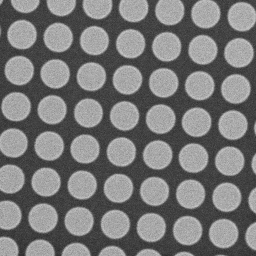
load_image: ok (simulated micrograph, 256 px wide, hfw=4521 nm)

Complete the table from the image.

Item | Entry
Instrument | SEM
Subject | an array of small figures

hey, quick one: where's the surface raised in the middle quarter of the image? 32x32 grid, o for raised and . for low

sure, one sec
o....oooo......oo...............
o...oooooo...ooooo.....ooo......
o..ooooooo...oooooo...oooooo....
o..ooooooo..ooooooo...oooooo...o
o..ooooooo..ooooooo..ooooooo..oo
....ooooo....oooooo..ooooooo..oo
.......o.....ooooo....oooooo...o
................o......oooo....o
................................
....oooo........................
...oooooo....ooooo.....ooo......
o..oooooo...oooooo...oooooo....o
...ooooooo..ooooooo..oooooo...oo
...oooooo...ooooooo..ooooooo..oo
....ooooo...oooooo...ooooooo..oo
.....oo......ooooo...oooooo...oo
...............o......oooo....oo
...............................o
...oooo.........................
..oooooo....ooooo.....ooo.......
..ooooooo..ooooooo...ooooo....oo
..ooooooo..ooooooo..ooooooo..ooo
..ooooooo..ooooooo..ooooooo..ooo
...ooooo...ooooooo..ooooooo..ooo
....oo......ooooo...oooooo...ooo
.....................ooooo...ooo
..............................oo
..ooooo.........................
..oooooo...ooooo......o.........
.ooooooo..ooooooo...ooooo.....oo
.ooooooo..ooooooo..ooooooo...ooo
.ooooooo..ooooooo..ooooooo..oooo